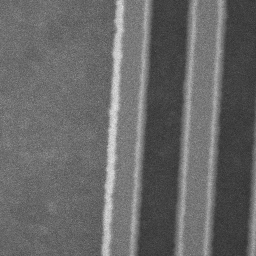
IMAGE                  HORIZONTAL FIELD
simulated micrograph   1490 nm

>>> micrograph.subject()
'one or a few lines or trenches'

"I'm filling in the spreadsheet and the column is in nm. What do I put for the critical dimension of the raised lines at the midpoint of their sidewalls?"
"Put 185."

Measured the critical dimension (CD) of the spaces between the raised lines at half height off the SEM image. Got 243 nanometers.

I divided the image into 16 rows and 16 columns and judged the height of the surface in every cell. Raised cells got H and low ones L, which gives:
LLLLLLLHHLLLHHLL
LLLLLLLHHLLLHHLL
LLLLLLLHHLLLHHLL
LLLLLLLHHLLLHHLL
LLLLLLLHHLLLHHLL
LLLLLLLHHLLLHHLL
LLLLLLLHHLLLHHLL
LLLLLLLHHLLLHHLL
LLLLLLLHHLLHHHLL
LLLLLLLHHLLHHLLL
LLLLLLLHHLLHHLLL
LLLLLLLHHLLHHLLL
LLLLLLLHHLLHHLLL
LLLLLLLHHLLHHLLL
LLLLLLLHHLLHHLLL
LLLLLLLHLLLHHLLL